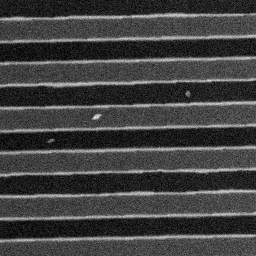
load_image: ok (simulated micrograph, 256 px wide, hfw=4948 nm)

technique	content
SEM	lines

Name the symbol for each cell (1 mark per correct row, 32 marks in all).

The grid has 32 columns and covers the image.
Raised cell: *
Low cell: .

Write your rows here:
................................
................................
********************************
********************************
****************************....
................................
................................
..........................******
********************************
********************************
************....................
................................
................................
.....***************************
********************************
********************************
................................
................................
..............................**
********************************
********************************
**************..................
................................
................................
....****************************
********************************
********************************
................................
................................
.............................***
********************************
********************************